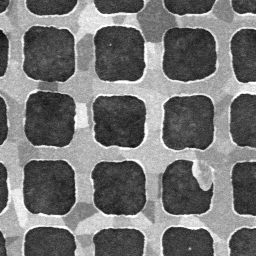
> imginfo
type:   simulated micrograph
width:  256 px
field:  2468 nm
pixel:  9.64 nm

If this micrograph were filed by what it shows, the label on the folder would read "a regular array of holes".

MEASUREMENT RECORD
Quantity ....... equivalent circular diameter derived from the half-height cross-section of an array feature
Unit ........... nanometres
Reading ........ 560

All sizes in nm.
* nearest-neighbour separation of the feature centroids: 644